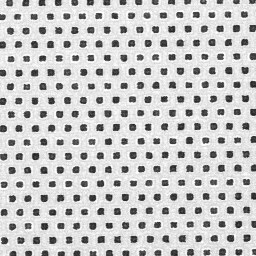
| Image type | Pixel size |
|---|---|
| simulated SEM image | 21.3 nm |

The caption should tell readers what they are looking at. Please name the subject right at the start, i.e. a regular array of holes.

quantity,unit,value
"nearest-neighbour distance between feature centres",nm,335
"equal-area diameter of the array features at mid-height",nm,175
